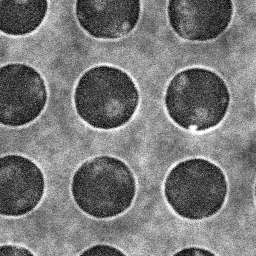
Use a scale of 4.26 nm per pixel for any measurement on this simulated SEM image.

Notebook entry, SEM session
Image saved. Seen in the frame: holes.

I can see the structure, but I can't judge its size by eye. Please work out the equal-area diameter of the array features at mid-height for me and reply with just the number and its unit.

274 nanometres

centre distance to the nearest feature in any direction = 0.381 micrometres